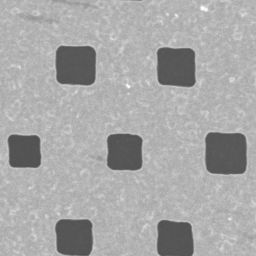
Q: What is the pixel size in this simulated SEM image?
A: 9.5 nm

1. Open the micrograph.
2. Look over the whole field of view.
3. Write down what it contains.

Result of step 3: holes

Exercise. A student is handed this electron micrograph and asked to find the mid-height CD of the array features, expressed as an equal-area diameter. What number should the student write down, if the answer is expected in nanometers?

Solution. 404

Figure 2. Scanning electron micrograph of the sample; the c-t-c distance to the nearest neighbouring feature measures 944 nm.